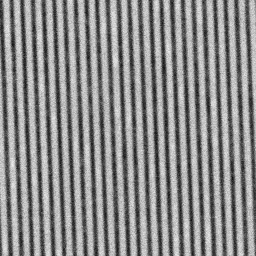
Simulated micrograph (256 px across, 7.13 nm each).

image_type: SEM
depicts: parallel lines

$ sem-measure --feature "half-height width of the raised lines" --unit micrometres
0.0437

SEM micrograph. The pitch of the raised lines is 0.0763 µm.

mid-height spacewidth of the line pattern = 31.2 nm